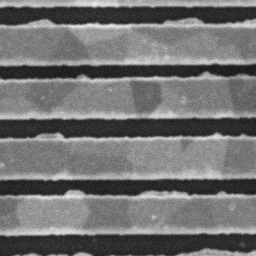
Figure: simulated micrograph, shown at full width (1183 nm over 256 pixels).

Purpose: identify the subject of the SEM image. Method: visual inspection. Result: lines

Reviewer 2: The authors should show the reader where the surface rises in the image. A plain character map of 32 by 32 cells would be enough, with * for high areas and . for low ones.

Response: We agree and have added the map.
**********.****.*....***********
................................
................................
********************************
********************************
********************************
********************************
********************************
................................
................................
********************************
********************************
********************************
********************************
***************************....*
................................
................................
********************************
********************************
********************************
********************************
********************************
................................
................................
***.*...******...**..**.********
********************************
********************************
********************************
********************************
................................
................................
................................